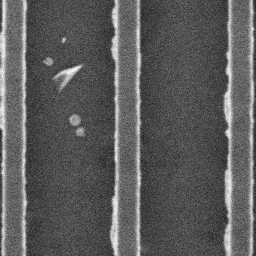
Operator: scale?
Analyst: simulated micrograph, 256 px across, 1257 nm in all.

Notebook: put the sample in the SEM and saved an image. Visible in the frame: lines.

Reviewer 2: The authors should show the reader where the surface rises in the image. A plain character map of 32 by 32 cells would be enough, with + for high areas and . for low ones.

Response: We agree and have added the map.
+++...........+++............+++
+++...........+++............+++
+++...........+++............+++
+++...........+++............+++
+++...........+++............+++
+++............++............+++
+++...........+++............+++
+++............++............+++
+++............++............+++
+++...........+++............+++
+++...........+++............+++
+++............++............+++
+++...........+++............+++
+++............++............+++
+++............++............+++
+++............++............+++
+++...........+++............+++
+++...........+++............+++
+++...........+++............+++
+++...........+++............+++
+++...........+++............+++
+++............++............+++
+++............++............+++
+++...........+++............+++
+++...........+++............+++
+++...........+++............+++
+++...........+++............+++
+++...........+++............+++
+++............++............+++
+++...........+++............+++
+++...........+++............+++
+++...........+++............+++